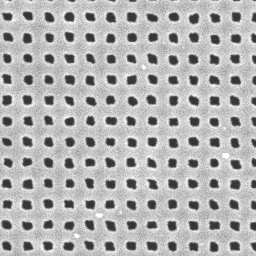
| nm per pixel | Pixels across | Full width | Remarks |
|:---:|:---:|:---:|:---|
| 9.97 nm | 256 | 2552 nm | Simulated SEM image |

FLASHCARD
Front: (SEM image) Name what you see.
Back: a regular array of holes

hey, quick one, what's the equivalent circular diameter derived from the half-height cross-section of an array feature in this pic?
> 103 nm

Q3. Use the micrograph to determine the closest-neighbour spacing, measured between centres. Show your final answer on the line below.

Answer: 20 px